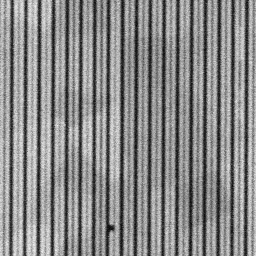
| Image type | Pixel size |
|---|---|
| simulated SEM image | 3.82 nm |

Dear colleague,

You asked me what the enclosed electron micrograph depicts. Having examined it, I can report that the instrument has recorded parallel lines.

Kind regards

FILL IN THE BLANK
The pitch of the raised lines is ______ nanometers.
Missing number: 26.5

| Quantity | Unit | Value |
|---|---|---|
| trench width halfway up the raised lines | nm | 13.8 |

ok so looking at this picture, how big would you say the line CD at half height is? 13.8 nanometres